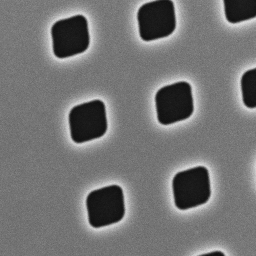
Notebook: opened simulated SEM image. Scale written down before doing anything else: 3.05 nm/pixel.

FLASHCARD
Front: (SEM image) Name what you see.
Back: holes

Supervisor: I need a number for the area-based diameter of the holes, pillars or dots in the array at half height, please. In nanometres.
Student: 124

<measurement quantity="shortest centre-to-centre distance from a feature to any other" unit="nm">265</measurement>